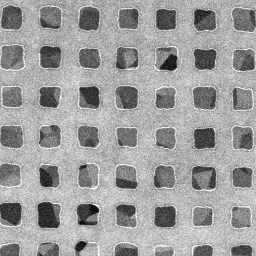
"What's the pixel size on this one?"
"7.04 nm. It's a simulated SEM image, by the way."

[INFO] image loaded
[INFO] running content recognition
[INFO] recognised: a regular array of raised bodies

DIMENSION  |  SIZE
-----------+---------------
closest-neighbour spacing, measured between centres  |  271 nanometres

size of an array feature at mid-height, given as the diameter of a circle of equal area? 24.6 pixels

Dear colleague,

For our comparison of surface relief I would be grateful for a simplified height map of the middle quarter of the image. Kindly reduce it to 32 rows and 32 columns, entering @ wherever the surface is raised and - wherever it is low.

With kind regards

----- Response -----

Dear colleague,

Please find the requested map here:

----@@@@@----@@@@@@----@@@@@----
------------------------@@@@----
--------------------------------
--------------------------------
--------------------------------
-------@------@@@---------------
----@@@@@----@@@@@-----@@@@@----
----@@@@@----@@@@@-----@@@@@----
----@@@@@----@@@@@-----@@@@@----
----@@@@@----@@@@@-----@@@@@----
----@@@@@----@@@@@-----@@@@@----
--------------------------------
--------------------------------
--------------------------------
--------------------------------
----@@@-------------------------
---@@@@@@----@@@@@-----@@@@@----
---@@@@@@----@@@@@-----@@@@@----
---@@@@@@----@@@@@-----@@@@@----
----@@@@@-----@@@@-----@@@@@----
----@@@@@-----@@@@-----@@@@@----
--------------------------------
--------------------------------
--------------------------------
--------------------------------
----@@@@-----@@@@------@@@@-----
----@@@@@----@@@@@-----@@@@@----
----@@@@@----@@@@@-----@@@@@----
---@@@@@@----@@@@@----@@@@@@----
----@@@@@----@@@@@----@@@@@@----
----@@@@-----@@@@@-----@@@@@----
--------------------------------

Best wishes